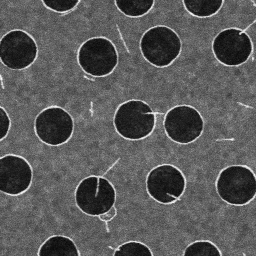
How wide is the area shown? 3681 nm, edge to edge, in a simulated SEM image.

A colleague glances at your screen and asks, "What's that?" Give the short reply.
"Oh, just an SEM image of a regular array of holes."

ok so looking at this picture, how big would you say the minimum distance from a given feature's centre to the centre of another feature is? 915 nm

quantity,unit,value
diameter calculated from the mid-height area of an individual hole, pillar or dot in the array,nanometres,548